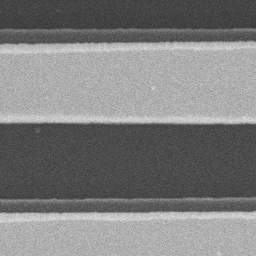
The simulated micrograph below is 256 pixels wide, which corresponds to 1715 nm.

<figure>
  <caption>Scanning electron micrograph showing lines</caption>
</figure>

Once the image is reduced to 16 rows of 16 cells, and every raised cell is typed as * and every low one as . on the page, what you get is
................
................
................
****************
****************
****************
****************
****************
................
................
................
................
................
****************
****************
****************